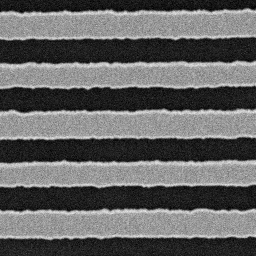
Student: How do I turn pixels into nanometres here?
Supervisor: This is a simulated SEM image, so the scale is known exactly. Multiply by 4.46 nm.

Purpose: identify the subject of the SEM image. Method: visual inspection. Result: lines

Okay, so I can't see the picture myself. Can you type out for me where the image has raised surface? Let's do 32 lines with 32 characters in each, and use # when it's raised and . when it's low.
................................
.#......#.######.###############
################################
################################
################################
................................
................................
................................
################################
################################
################################
................................
................................
................................
################################
################################
################################
................................
................................
................................
################################
################################
################################
................................
................................
................................
################################
################################
################################
################################
................................
................................